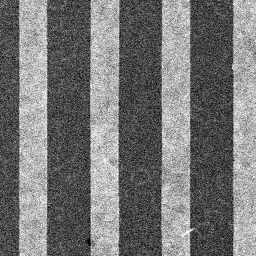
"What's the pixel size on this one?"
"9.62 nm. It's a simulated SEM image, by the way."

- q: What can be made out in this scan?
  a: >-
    one or a few lines or trenches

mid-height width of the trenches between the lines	423	nm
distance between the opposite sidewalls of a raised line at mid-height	27.2	px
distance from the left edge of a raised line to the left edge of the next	687	nm